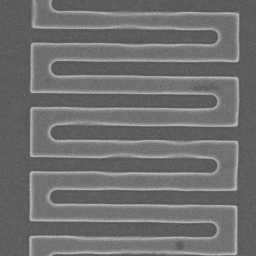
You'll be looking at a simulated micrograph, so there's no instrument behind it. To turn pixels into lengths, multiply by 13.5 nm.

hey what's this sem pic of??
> groups of lines, slits or small figures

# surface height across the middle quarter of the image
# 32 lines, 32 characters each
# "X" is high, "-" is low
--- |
--------------------------------
--------------------------------
--------------------------------
XXXXXXXXXXXXXXXXXXXXXXXXXXXXXXXX
XXXXXXXXXXXXXXXXXXXXXXXXXXXXXXXX
XXXXXXXXXXXXXXXXXXXXXXXXXXXXXXXX
XXXXXXXXXXXXXXXXXXXXXXXXXXXXXXXX
-------------------------------X
--------------------------------
--------------------------------
--------------------------------
XXXXXXXXXXXXXXXXXXXXXXXXXXXXXXXX
XXXXXXXXXXXXXXXXXXXXXXXXXXXXXXXX
XXXXXXXXXXXXXXXXXXXXXXXXXXXXXXXX
XXXXXXXXXXXXXXXXXXXXXXXXXXXXXXXX
---------------------XX---------
--------------------------------
--------------------------------
--------------------------------
XXXXXXXXXXXXXXXXXXXXXXXXXXX-----
XXXXXXXXXXXXXXXXXXXXXXXXXXXXXXXX
XXXXXXXXXXXXXXXXXXXXXXXXXXXXXXXX
XXXXXXXXXXXXXXXXXXXXXXXXXXXXXXXX
--------------------------------
--------------------------------
--------------------------------
--------------------------------
XXXXXXXXXXXXXXXXXXXXXXXXXXXXXXXX
XXXXXXXXXXXXXXXXXXXXXXXXXXXXXXXX
XXXXXXXXXXXXXXXXXXXXXXXXXXXXXXXX
XXXXXXXXXXXXXXXXXXXXXXXXXXXXXXXX
------------------XXXX------XXXX